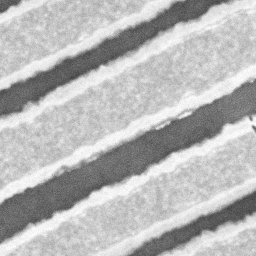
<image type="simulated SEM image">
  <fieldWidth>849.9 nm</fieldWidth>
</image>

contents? one or a few lines or trenches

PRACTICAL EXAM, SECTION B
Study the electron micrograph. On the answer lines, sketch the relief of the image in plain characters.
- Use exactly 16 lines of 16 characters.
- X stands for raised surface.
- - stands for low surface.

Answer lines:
-XXXXXXXXX-----X
XXXXXXX------XXX
XXXXXX-----XXXXX
XXXX-----XXXXXXX
XX-----XXXXXXXXX
-----XXXXXXXXX--
---XXXXXXXXX----
-XXXXXXXX-------
XXXXXXX-------XX
XXXXX-------XXXX
XXX-------XXXXXX
X-------XXXXXXXX
------XXXXXXXX--
----XXXXXXXX----
--XXXXXXX-----XX
XXXXXXXX----XXXX